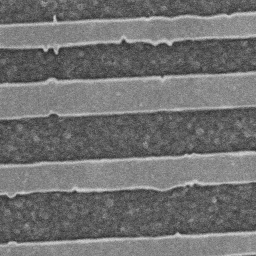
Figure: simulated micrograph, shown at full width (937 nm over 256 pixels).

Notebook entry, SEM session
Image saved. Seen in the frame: one or a few lines or trenches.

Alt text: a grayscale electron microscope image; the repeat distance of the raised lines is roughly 262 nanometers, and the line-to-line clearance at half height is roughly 174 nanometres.